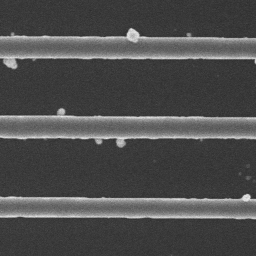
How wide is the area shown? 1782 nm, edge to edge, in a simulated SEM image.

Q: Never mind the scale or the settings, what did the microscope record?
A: lines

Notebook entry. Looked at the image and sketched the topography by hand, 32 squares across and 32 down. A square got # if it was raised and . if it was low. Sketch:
................................
................................
................................
................................
...............###..............
################################
################################
................................
................................
................................
................................
................................
................................
................................
................................
################################
################################
................................
................................
................................
................................
................................
................................
................................
................................
################################
################################
................................
................................
................................
................................
................................